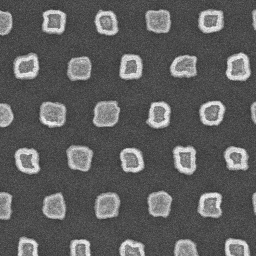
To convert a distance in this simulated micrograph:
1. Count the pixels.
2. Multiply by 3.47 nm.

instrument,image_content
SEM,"a regular array of raised bodies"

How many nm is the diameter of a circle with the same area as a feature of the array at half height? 84.1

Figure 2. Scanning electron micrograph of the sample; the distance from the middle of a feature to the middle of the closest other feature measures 179 nanometers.